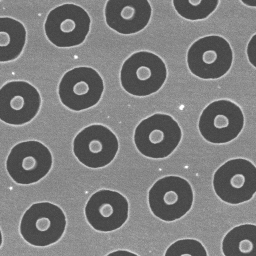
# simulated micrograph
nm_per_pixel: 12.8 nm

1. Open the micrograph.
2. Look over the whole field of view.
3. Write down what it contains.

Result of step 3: a regular array of ring-shaped grooves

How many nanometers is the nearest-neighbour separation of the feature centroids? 817